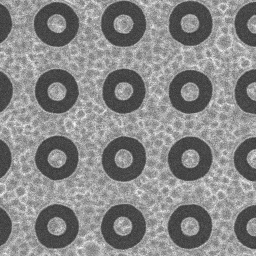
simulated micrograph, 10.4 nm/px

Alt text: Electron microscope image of a regular array of ring-shaped grooves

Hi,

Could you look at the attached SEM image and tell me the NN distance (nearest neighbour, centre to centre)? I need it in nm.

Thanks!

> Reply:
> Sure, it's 693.